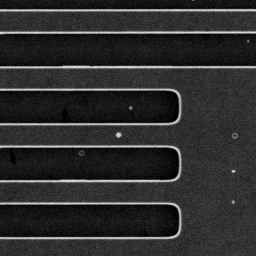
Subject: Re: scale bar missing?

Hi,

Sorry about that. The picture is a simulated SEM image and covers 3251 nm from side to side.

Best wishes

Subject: groups of lines, slits or small figures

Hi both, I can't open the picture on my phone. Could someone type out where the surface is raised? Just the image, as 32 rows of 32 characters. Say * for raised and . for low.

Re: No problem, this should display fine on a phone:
................................
********************************
********************************
********************************
................................
................................
................................
................................
********************************
********************************
********************************
......................**********
......................**********
......................**********
......................**********
.....................***********
********************************
********************************
......................**********
......................**********
.......................*********
......................**********
.....................***********
********************************
********************************
.....................***********
......................**********
.......................*********
......................**********
......................**********
********************************
********************************